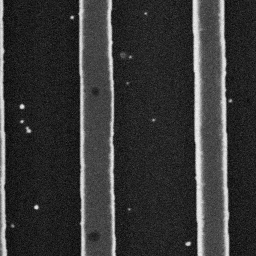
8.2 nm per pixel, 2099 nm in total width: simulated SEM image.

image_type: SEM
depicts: lines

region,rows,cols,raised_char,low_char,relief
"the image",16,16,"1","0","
0000011000001100
0000011000001100
0000011000001100
0000011000001100
0000011000001100
0000011000001100
0000011000001100
0000011000001100
0000011000001100
0000011000001100
0000011000001100
0000011000001100
0000011000001100
0000011000001100
0000011000001100
0000011000001100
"